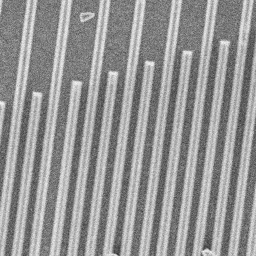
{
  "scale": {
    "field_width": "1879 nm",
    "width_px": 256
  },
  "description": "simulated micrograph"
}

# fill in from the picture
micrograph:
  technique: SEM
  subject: parallel lines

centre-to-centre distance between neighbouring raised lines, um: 0.131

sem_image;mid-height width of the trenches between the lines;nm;79.2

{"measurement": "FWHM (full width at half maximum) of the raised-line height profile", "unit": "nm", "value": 52.7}